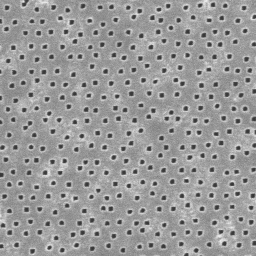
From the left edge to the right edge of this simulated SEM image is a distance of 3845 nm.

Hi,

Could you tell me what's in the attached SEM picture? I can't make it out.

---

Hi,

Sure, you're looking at a regular array of holes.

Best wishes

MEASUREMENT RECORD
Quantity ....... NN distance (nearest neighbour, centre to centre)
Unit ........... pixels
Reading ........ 11.8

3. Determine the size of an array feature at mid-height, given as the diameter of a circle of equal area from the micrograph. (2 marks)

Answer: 75.8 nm